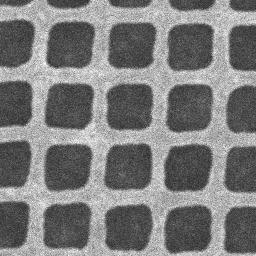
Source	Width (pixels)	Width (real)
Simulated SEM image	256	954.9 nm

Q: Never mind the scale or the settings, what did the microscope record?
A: a regular array of holes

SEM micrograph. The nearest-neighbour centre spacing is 221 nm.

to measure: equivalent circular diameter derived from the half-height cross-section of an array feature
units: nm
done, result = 190